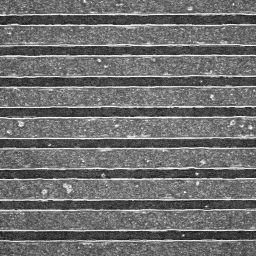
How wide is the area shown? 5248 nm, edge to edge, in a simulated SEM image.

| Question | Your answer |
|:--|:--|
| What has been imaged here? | parallel lines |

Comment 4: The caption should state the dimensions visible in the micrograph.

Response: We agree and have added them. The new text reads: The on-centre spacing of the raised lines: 632 nm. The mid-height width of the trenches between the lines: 208 nm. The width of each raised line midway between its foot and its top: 436 nm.